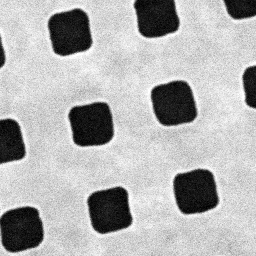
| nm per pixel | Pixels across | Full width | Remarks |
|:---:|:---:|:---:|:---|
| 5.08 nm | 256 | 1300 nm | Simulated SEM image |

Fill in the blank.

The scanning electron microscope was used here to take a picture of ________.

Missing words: holes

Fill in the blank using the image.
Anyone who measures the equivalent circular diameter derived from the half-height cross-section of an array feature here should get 236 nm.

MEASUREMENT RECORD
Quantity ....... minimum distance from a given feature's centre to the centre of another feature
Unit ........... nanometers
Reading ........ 445